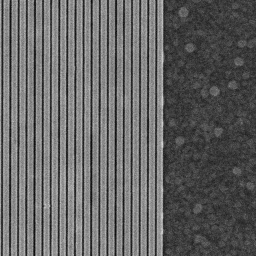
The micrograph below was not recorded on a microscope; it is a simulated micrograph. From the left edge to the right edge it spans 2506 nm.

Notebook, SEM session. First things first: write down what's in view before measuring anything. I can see parallel lines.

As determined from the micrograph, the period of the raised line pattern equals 79.3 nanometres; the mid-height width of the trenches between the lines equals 28.1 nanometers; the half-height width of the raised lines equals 0.0575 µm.